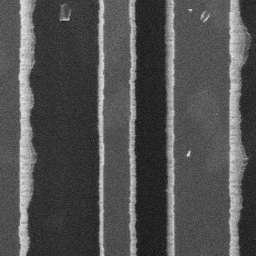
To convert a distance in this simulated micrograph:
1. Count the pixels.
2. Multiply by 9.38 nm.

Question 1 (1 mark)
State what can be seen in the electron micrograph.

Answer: lines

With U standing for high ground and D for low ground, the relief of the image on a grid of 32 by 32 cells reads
UUUDDDDDDDDDDUUUUDDDDUUUUUUUUDDD
UUUDDDDDDDDDDUUUUDDDDUUUUUUUUDDD
UUUDDDDDDDDDDUUUUDDDDUUUUUUUUDDD
UUUDDDDDDDDDDUUUUDDDDUUUUUUUUDDD
UUUDDDDDDDDDDUUUUDDDDUUUUUUUUDDD
UUUDDDDDDDDDDUUUUDDDDUUUUUUUUDDD
UUUDDDDDDDDDDUUUUDDDDUUUUUUUUDDD
UUUDDDDDDDDDDUUUUDDDDUUUUUUUUDDD
UUUDDDDDDDDDDUUUUDDDDUUUUUUUUDDD
UUUDDDDDDDDDDUUUUDDDDUUUUUUUUDDD
UUUDDDDDDDDDDUUUUDDDDUUUUUUUUDDD
UUUDDDDDDDDDDUUUUDDDDUUUUUUUUDDD
UUUDDDDDDDDDDUUUUDDDDUUUUUUUUDDD
UUUDDDDDDDDDDUUUUDDDDUUUUUUUUDDD
UUUDDDDDDDDDDUUUUDDDDUUUUUUUUDDD
UUUDDDDDDDDDDUUUUDDDDUUUUUUUUDDD
UUUDDDDDDDDDDUUUUDDDDUUUUUUUUDDD
UUUDDDDDDDDDDUUUUDDDDUUUUUUUUDDD
UUUDDDDDDDDDDUUUDDDDDUUUUUUUUDDD
UUUDDDDDDDDDDUUUUDDDDUUUUUUUUDDD
UUUDDDDDDDDDDUUUUDDDDUUUUUUUUDDD
UUUDDDDDDDDDDUUUUDDDDUUUUUUUUDDD
UUUDDDDDDDDDDUUUUDDDDUUUUUUUUDDD
UUUDDDDDDDDDDUUUUDDDDUUUUUUUUDDD
UUUDDDDDDDDDDUUUUDDDDUUUUUUUUDDD
UUUDDDDDDDDDDUUUUDDDDUUUUUUUUDDD
UUUDDDDDDDDDDUUUUDDDDUUUUUUUUDDD
UUUDDDDDDDDDDUUUUDDDDUUUUUUUUDDD
UUUDDDDDDDDDDUUUUDDDDUUUUUUUUDDD
UUUDDDDDDDDDDUUUUDDDDUUUUUUUUDDD
UUUDDDDDDDDDDUUUUDDDDDUUUUUUUDDD
UUUDDDDDDDDDDUUUUDDDDUUUUUUUUDDD